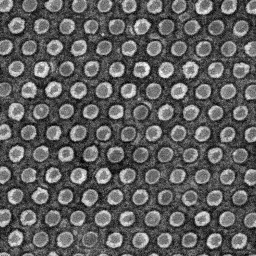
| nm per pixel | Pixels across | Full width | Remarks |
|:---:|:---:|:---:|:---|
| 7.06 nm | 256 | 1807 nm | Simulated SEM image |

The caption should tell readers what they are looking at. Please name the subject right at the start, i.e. a regular array of raised bodies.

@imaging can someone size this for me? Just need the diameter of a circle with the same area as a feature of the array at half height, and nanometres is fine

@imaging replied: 104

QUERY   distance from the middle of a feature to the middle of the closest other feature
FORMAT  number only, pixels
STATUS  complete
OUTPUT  24.2